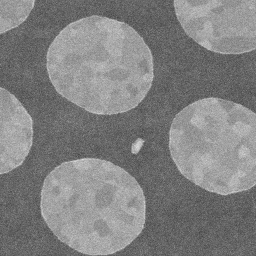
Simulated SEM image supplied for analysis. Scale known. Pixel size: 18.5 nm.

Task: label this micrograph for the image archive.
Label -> raised bodies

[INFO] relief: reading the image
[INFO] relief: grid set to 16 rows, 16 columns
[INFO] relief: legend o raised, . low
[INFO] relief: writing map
oo.........ooooo
o...oooo...ooooo
...oooooo...oooo
...oooooo.......
...ooooooo......
...oooooo.......
o....oooo...ooo.
oo.........ooooo
oo.........ooooo
oo.........ooooo
o...ooo....ooooo
...oooooo...oooo
...oooooo.......
...oooooo.......
...oooooo.......
.....ooo........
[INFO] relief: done